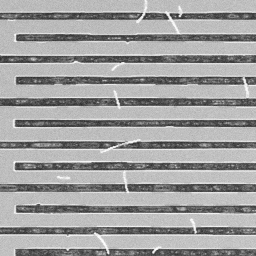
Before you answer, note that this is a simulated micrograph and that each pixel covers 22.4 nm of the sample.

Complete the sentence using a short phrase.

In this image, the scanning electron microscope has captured parallel lines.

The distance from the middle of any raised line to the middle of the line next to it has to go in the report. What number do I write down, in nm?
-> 482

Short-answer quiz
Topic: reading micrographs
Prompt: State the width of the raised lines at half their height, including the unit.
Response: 13.2 pixels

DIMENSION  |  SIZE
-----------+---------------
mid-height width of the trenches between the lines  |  171 nm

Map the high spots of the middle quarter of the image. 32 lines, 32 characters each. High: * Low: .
********************************
********************************
********************************
................................
................................
********************************
********************************
********************************
.............*..................
.............*..................
.............*..................
********************************
********************************
********************************
................................
................................
********************************
********************************
********************************
................**..............
................................
********************************
********************************
********************************
................................
..................**............
................................
********************************
********************************
********************************
................................
................................